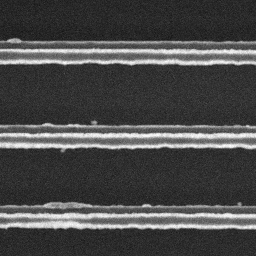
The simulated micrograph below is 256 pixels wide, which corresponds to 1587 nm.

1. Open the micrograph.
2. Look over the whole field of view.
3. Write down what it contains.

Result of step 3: lines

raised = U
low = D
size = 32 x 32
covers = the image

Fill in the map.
DDDDDDDDDDDDDDDDDDDDDDDDDDDDDDDD
DDDDDDDDDDDDDDDDDDDDDDDDDDDDDDDD
DDDDDDDDDDDDDDDDDDDDDDDDDDDDDDDD
DDDDDDDDDDDDDDDDDDDDDDDDDDDDDDDD
DDDDDDDDDDDDDDDDDDDDDDDDDDDDDDDD
UUUUUUUUUUUUUUUUUUUUUUUUUUUUUUUU
UUUUUUUUUUUUUUUUUUUUUUUUUUUUUUUU
UUUUUUUUUUUUUUUUUUUUUUUUUUUUUUUU
DDDDDDDDDDDDDDDDDDDDDDDDDDDDDDDD
DDDDDDDDDDDDDDDDDDDDDDDDDDDDDDDD
DDDDDDDDDDDDDDDDDDDDDDDDDDDDDDDD
DDDDDDDDDDDDDDDDDDDDDDDDDDDDDDDD
DDDDDDDDDDDDDDDDDDDDDDDDDDDDDDDD
DDDDDDDDDDDDDDDDDDDDDDDDDDDDDDDD
DDDDDDDDDDDDDDDDDDDDDDDDDDDDDDDD
DDDDDUDDDDDDDDDDDDDDDDDDDDDDDDDD
UUUUUUUUUUUUUUUUUUUUUUUUUUUUUUUU
UUUUUUUUUUUUUUUUUUUUUUUUUUUUUUUU
DDDDDDDDDDDDDDUDUDDDDDDDDDDDDDDU
DDDDDDDDDDDDDDDDDDDDDDDDDDDDDDDD
DDDDDDDDDDDDDDDDDDDDDDDDDDDDDDDD
DDDDDDDDDDDDDDDDDDDDDDDDDDDDDDDD
DDDDDDDDDDDDDDDDDDDDDDDDDDDDDDDD
DDDDDDDDDDDDDDDDDDDDDDDDDDDDDDDD
DDDDDDDDDDDDDDDDDDDDDDDDDDDDDDDD
DDDDDDUUUUUDDDDDDDDDDDDDDDDDDDDD
UUUUUUUUUUUUUUUUUUUUUUUUUUUUUUUU
UUUUUUUUUUUUUUUUUUUUUUUUUUUUUUUU
DDDDDDDDDDUDDDDDDDDUUDDDDDDDDUUU
DDDDDDDDDDDDDDDDDDDDDDDDDDDDDDDD
DDDDDDDDDDDDDDDDDDDDDDDDDDDDDDDD
DDDDDDDDDDDDDDDDDDDDDDDDDDDDDDDD